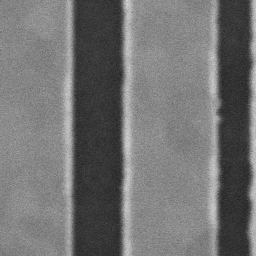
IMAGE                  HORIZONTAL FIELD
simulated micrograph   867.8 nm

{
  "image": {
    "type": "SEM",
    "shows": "one or a few lines or trenches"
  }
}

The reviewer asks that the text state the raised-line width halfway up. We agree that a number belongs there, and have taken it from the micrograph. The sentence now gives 305 nanometres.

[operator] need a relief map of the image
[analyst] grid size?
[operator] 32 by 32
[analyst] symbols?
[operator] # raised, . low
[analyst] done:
#########.......###########.....
#########.......###########.....
#########.......###########.....
#########.......###########.....
#########.......###########.....
#########.......###########.....
#########.......###########.....
#########.......###########.....
#########.......###########.....
#########.......###########.....
#########.......###########.....
#########.......###########.....
#########.......###########.....
#########.......###########.....
#########.......###########.....
#########.......###########.....
#########.......###########.....
#########......############.....
#########.......###########.....
#########.......###########.....
#########.......###########.....
#########.......###########.....
#########.......###########.....
#########.......###########.....
#########.......###########.....
#########.......###########.....
#########.......###########.....
#########.......###########.....
#########.......###########.....
#########.......###########....#
#########.......###########.....
#########.......###########.....